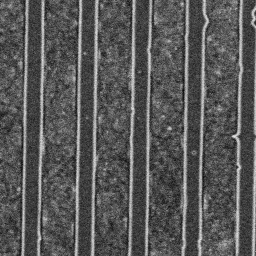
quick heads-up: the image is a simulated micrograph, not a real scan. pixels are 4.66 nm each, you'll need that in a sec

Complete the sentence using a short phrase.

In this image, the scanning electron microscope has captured parallel lines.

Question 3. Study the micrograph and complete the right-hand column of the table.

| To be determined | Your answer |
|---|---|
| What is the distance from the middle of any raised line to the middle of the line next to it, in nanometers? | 250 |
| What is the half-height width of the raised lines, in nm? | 81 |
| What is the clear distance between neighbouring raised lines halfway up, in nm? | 171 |